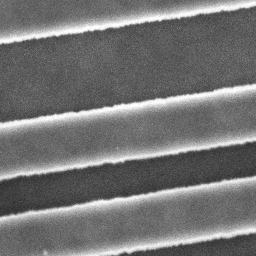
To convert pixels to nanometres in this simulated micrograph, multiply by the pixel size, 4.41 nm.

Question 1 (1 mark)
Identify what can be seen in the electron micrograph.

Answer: lines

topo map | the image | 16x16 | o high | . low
oooooooooooooo..
oooooooo........
o...............
................
................
...............o
.........ooooooo
..oooooooooooooo
oooooooooooooooo
ooooooooooo.....
oooo............
.............ooo
.......ooooooooo
.ooooooooooooooo
oooooooooooooooo
ooooooooo.......